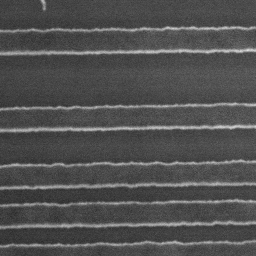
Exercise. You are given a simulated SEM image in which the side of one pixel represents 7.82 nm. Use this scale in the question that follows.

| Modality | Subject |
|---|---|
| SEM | lines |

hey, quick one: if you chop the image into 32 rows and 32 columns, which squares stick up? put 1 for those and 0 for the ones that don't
00000000000000000000000000000000
00000000000000000000000000000000
00000000000000000000000000000000
00000000000000000000000000001101
11111111111111111111111111111111
11111111111111111111111111111111
11111111111111111010000000000000
00000000000000000000000000000000
00000000000000000000000000000000
00000000000000000000000000000000
00000000000000000000000000000000
00000000000000000000000000000000
00000000000000000000000000000000
01101111111111111111111111111111
11111111111111111111111111111111
11111111111111111111111111111111
00000000000000000000000000000000
00000000000000000000000000000000
00000000000000000000000000000000
00000000000000000000000000000000
00000001000111111111111111111111
11111111111111111111111111111111
11111111111111111111111111111111
11011000000000000000000000000000
00000000000000000000000000000000
00001000011111111111111111111111
11111111111111111111111111111111
11111111111111111111111111111111
00000000000000000000000000000000
00000000000000000000000000000000
00000000000011011111111111111111
11111111111111111111111111111111